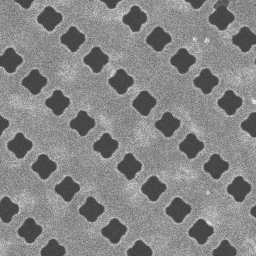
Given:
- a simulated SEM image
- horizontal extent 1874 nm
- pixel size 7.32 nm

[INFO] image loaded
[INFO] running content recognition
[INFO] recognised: a regular array of holes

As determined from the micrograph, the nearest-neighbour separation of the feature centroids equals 0.23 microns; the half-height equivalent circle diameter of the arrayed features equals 167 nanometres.